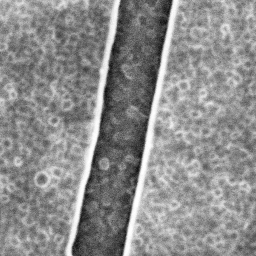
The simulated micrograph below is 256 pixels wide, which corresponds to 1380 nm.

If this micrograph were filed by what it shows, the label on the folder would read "one or a few lines or trenches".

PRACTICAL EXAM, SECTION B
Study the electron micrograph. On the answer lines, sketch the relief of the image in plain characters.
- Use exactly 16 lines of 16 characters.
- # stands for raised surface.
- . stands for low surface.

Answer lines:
#######....#####
#######....#####
#######...######
#######...######
#######...######
######....######
######....######
######...#######
######...#######
######...#######
#####....#######
#####....#######
#####....#######
#####...########
#####...########
####....########